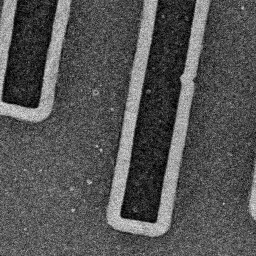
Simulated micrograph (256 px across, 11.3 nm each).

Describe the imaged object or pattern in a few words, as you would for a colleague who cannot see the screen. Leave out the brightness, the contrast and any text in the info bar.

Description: one or a few lines or trenches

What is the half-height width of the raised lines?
0.57 microns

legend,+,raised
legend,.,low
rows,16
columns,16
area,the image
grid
.+++.....++++...
++++.....+++....
++++.....+++....
+++......+++....
+++......+++....
+++......+++....
+++.....++++....
........+++.....
........+++.....
........+++.....
........+++.....
.......++++.....
.......+++......
.......+++......
................
................